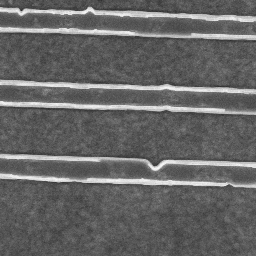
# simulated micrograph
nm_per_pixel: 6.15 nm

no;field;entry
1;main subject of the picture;one or a few lines or trenches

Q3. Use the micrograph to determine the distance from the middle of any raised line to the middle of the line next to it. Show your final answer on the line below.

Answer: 453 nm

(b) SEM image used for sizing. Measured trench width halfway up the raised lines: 304 nm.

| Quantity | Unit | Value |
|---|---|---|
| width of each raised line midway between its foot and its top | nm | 146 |